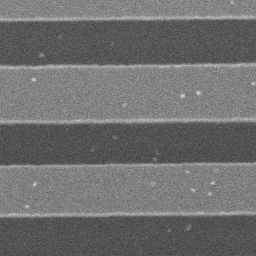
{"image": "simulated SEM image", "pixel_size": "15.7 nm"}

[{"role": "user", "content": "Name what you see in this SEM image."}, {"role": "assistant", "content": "lines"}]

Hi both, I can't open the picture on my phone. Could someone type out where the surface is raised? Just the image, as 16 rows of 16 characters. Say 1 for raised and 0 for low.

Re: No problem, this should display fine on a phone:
1111111111111111
0000000000000000
0000000000000000
0000000000000000
1111111111111111
1111111111111111
1111111111111111
1111111111100000
0000000000000000
0000000000000000
1111111111111111
1111111111111111
1111111111111111
0000000000000000
0000000000000000
0000000000000000